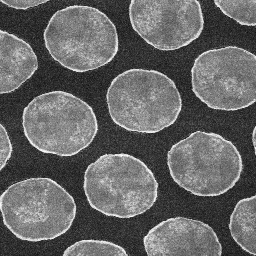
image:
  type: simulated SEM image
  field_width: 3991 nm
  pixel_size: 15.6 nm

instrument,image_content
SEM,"raised bodies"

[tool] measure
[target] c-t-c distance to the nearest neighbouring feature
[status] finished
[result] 87.1 pixels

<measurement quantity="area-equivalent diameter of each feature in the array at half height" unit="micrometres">1.06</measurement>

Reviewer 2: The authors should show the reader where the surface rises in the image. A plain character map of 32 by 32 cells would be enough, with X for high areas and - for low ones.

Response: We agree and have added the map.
-XXXX-----------XXXXXXXXX--XXXXX
-------XXXXX----XXXXXXXXX---XXXX
------XXXXXXXX--XXXXXXXXX----XXX
------XXXXXXXX---XXXXXXXX-------
XX----XXXXXXXXX---XXXXXXX-------
XXX---XXXXXXXXX----XXXX---------
XXXX--XXXXXXXX------------XXXXX-
XXXXX--XXXXXXX-----------XXXXXXX
XXXXX----XXX------------XXXXXXXX
XXXX-----------XXXXXX---XXXXXXXX
XXX-----------XXXXXXXX--XXXXXXXX
X------X------XXXXXXXX--XXXXXXXX
----XXXXXX---XXXXXXXXXX--XXXXXXX
---XXXXXXXX---XXXXXXXXX----XXX--
---XXXXXXXXX--XXXXXXXX----------
---XXXXXXXXX---XXXXXX-----------
X--XXXXXXXXX--------------------
X---XXXXXXX------------XXXXX----
X----XXXXX------------XXXXXXX---
X------------XXX-----XXXXXXXXX--
X-----------XXXXXX---XXXXXXXXX--
-----------XXXXXXXX--XXXXXXXXX--
---XXX-----XXXXXXXX---XXXXXXX---
-XXXXXXX---XXXXXXXXX---XXXXXX---
XXXXXXXXX--XXXXXXXX-------------
XXXXXXXXX--XXXXXXXX-----------XX
XXXXXXXXX----XXXXX-----------XXX
-XXXXXXXX------------XXX-----XXX
-XXXXXXX-----------XXXXXXX---XXX
--XXXXX-----------XXXXXXXXX--XXX
---------XXXXX----XXXXXXXXX---XX
--------XXXXXXXX--XXXXXXXXXX---X